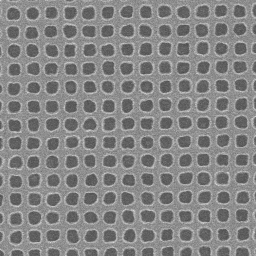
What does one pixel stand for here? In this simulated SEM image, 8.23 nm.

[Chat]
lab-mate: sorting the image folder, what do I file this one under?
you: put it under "a regular array of holes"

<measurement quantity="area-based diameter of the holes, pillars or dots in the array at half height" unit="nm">107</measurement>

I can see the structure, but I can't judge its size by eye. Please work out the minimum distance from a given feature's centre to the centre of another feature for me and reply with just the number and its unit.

149 nm